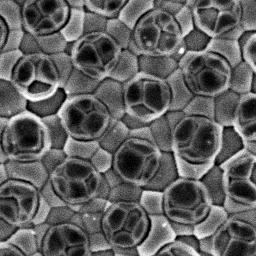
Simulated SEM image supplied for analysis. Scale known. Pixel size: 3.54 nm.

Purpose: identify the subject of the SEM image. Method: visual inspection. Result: a regular array of raised bodies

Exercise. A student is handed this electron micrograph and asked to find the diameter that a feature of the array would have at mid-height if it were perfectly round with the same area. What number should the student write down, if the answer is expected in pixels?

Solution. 39.2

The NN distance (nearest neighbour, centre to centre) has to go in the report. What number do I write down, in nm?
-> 224